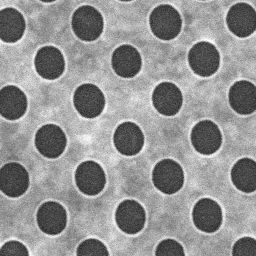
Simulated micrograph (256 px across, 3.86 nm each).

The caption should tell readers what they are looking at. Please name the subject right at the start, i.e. a regular array of holes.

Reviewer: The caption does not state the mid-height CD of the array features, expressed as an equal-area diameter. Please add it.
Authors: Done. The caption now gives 134 nm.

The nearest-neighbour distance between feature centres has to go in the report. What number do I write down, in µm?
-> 0.21